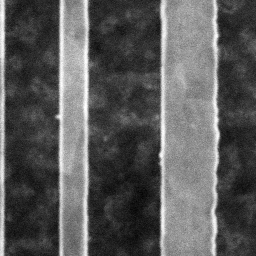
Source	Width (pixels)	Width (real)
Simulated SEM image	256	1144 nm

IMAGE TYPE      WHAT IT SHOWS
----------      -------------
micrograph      one or a few lines or trenches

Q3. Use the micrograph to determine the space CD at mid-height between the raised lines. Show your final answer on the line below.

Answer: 291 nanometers